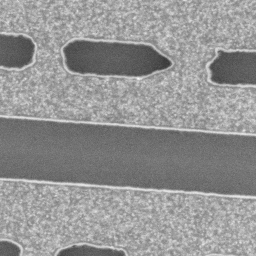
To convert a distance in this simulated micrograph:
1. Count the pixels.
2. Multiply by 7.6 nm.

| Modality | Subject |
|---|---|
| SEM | one or a few lines or trenches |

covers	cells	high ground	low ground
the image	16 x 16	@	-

@@@@@@@@@@@@@@@@
@@@@@@@@@@@@@@@@
--@@@-@@@@@@@@@@
--@@------@@@---
@@@@@-----@@@---
@@@@@@@@@@@@@@@@
@@@@@@@@@@@@@@@@
---@@@@@@@@@@@@@
----------------
----------------
----------------
@@@@------------
@@@@@@@@@@@@@@@@
@@@@@@@@@@@@@@@@
@@@@@@@@@@@@@@@@
-@@@---@@@@@@@@@